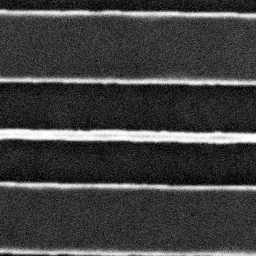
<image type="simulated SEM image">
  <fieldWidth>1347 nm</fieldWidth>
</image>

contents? lines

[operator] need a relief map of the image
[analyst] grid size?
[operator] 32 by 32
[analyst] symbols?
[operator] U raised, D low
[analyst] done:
DDDDDDDDDDDDDDDDDDDDDDDDDDDDDDDD
UUUUUUUDUUUDDUUDDDDDDDDDDDDDDDDD
UUUUUUUUUUUUUUUUUUUUUUUUUUUUUUUU
UUUUUUUUUUUUUUUUUUUUUUUUUUUUUUUU
UUUUUUUUUUUUUUUUUUUUUUUUUUUUUUUU
UUUUUUUUUUUUUUUUUUUUUUUUUUUUUUUU
UUUUUUUUUUUUUUUUUUUUUUUUUUUUUUUU
UUUUUUUUUUUUUUUUUUUUUUUUUUUUUUUU
UUUUUUUUUUUUUUUUUUUUUUUUUUUUUUUU
UUUUUUUUUUUUUUUUUUUUUUUUUUUUUUUU
DDDDDDDDDDDDDDDDDDDDDDDDDDDDDDDD
DDDDDDDDDDDDDDDDDDDDDDDDDDDDDDDD
DDDDDDDDDDDDDDDDDDDDDDDDDDDDDDDD
DDDDDDDDDDDDDDDDDDDDDDDDDDDDDDDD
DDDDDDDDDDDDDDDDDDDDDDDDDDDDDDDD
DDDDDDDDDDDDDDDDDDDDDDDDDDDDDDDD
UUUUDDDDDDDDDDDDDDDDDDDDDDDDDDDD
DDDDDDDDDDDDDDDDDDDUDDUUUUUUUUUU
DDDDDDDDDDDDDDDDDDDDDDDDDDDDDDDD
DDDDDDDDDDDDDDDDDDDDDDDDDDDDDDDD
DDDDDDDDDDDDDDDDDDDDDDDDDDDDDDDD
DDDDDDDDDDDDDDDDDDDDDDDDDDDDDDDD
DDDDDDDDDDDDDDDDDDDDDDDDDDDDDDDD
UUUUUUUUUUUUUUUUUUUUUUUUUUUUUUUU
UUUUUUUUUUUUUUUUUUUUUUUUUUUUUUUU
UUUUUUUUUUUUUUUUUUUUUUUUUUUUUUUU
UUUUUUUUUUUUUUUUUUUUUUUUUUUUUUUU
UUUUUUUUUUUUUUUUUUUUUUUUUUUUUUUU
UUUUUUUUUUUUUUUUUUUUUUUUUUUUUUUU
UUUUUUUUUUUUUUUUUUUUUUUUUUUUUUUU
UUUUUUUUUUUUUUUUUUUUUUUUUUUUUUUU
UUUUUUUUUUUUUUUUUUUUUUUUUUUUUUUU